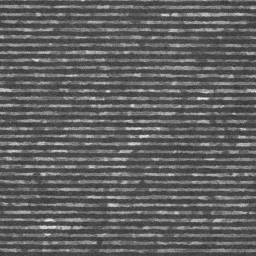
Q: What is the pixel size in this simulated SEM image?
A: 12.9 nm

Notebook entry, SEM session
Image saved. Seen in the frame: parallel lines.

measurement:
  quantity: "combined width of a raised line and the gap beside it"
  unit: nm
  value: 98.5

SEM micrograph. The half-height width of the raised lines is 29.1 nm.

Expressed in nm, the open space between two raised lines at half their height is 71.2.